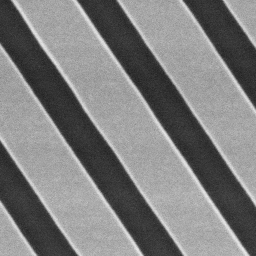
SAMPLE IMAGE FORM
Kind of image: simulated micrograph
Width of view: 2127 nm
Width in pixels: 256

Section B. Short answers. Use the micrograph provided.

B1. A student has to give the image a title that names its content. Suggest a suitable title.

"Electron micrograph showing lines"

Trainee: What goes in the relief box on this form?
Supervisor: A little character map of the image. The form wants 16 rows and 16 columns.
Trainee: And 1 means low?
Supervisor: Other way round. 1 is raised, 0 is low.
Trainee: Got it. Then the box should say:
0111100011110011
0011110011110001
0011110001111000
1001111000111100
1000111100111100
1100111110011110
1110011110001111
1110001111001111
1111001111000111
0111100111100011
0111100011110011
0011110011111001
0001111001111000
1001111000111100
1000111100011110
1100011110011110